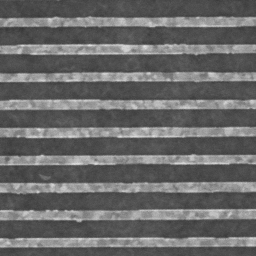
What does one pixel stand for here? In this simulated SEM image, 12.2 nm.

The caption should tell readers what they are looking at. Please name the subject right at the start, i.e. parallel lines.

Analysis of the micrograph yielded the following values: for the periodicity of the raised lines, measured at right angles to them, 336 nm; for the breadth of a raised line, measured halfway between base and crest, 0.0991 micrometres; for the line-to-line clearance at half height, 232 nm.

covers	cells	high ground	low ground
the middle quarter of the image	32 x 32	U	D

DDDDDDDDDDDDDDDDDDDDDDDDDDDDDDDD
DDDDDDDDDDDDDDDDDDDDDDDDDDDDDDDD
DUUUUUUUUUUUUUUUUUUUUUUUUUUUUUUU
UUUUUUUUUUUUUUUUUUUUUUUUUUUUUUUU
DDDDDDDDDDDDDDDDDDDDDDDDDDDDDDDD
DDDDDDDDDDDDDDDDDDDDDDDDDDDDDDDD
DDDDDDDDDDDDDDDDDDDDDDDDDDDDDDDD
DDDDDDDDDDDDDDDDDDDDDDDDDDDDDDDD
DDDDDDDDDDDDDDDDDDDDDDDDDDDDDDDD
UUUUUUUUUUUUUUUUUUUUUUUUUUUUUUUU
UUUUUUUUUUUUUUUUUUUUUUUUUUUUUUUU
DDDDDDDDDDDDDDDDDDDDDDDDDDDDDDDD
DDDDDDDDDDDDDDDDDDDDDDDDDDDDDDDD
DDDDDDDDDDDDDDDDDDDDDDDDDDDDDDDD
DDDDDDDDDDDDDDDDDDDDDDDDDDDDDDDD
DDDDDDDDDDDDDDDDDDDDDDDDDDDDDDDD
UUUUUUUUUUUUUUUUUUUUUUUUUUUUUUUU
UUUUUUUUUUUUUUUUUUUUUUUUUUUUUUUU
DDDDDDDDDDDDDDDDDDDDDDDDDDDDDDDD
DDDDDDDDDDDDDDDDDDDDDDDDDDDDDDDD
DDDDDDDDDDDDDDDDDDDDDDDDDDDDDDDD
DDDDDDDDDDDDDDDDDDDDDDDDDDDDDDDD
DDDDDDDDDDDDDDDDDDDDDDDDDDDDDDDD
UUUUUUUUUUUUUUUUUUUUUUUUUUUUUUUU
UUUUUUUUUUUUUUUUUUUUUUUUUUUUUUUU
DDDDDDDDDDDDDDDDDDDDDDDDDDDDDDDD
DDDDDDDDDDDDDDDDDDDDDDDDDDDDDDDD
DDDDDDDDDDDDDDDDDDDDDDDDDDDDDDDD
DDDDDDDDDDDDDDDDDDDDDDDDDDDDDDDD
DDDDDDDDDDDDDDDDDDDDDDDDDDDDDDDD
UUUUUUUUUUUUUUUUUUUUUUUUUUUUUUUU
UUUUUUUUUUUUUUUUUUUUUUUUUUUUUUUU